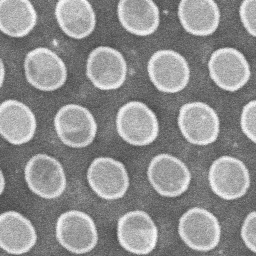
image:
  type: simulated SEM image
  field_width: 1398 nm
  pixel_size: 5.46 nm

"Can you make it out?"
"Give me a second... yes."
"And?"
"a regular array of raised bodies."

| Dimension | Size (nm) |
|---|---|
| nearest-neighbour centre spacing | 329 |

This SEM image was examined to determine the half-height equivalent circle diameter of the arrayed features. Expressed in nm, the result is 210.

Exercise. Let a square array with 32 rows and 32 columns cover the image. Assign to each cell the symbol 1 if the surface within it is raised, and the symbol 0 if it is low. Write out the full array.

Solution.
11110001111000011110000111100011
11110001111100011111001111100011
11110001111100011111000111100001
11110000111100001110000111100001
00000000010000000000000000000000
00000000000000000000000000000000
00001100000011000000000000011000
00011110000111100001111000111100
00011111000111110001111000111110
00011111000111100001111000011110
00001111000011100001111000011100
00000000000000000000000000000000
00000000000000000000000000000000
11100000110000011100000111000001
11110001111000011110000111100011
11110001111100011110000111100011
11110001111100011110000111100001
01100000111000001110000011000000
00000000000000000000000000000000
00000000000000000000100000000000
00001110000011100001111000011100
00011111000111110001111000111110
00011111000111110001111000111110
00001111000011110000111000011110
00000110000001100000000000001100
00000000000000000000000000000000
00000000000000000000000011000000
11100000111000011110000111100001
11110001111100011110000111100011
11110001111100011110000111100011
11110000111100011110000011100001
01100000000000000100000000000000